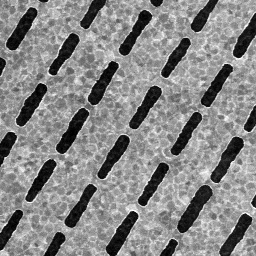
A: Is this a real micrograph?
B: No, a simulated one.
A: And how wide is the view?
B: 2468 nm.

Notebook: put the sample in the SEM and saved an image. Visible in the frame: a regular array of holes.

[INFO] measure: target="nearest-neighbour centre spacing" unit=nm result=464